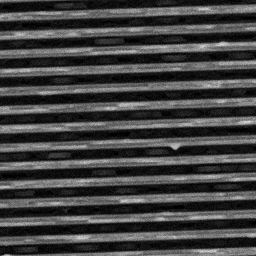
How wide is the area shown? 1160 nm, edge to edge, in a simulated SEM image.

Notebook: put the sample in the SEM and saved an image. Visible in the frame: parallel lines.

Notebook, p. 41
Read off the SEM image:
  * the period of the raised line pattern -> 84.6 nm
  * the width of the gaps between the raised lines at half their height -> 0.0504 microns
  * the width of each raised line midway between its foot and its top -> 7.75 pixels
